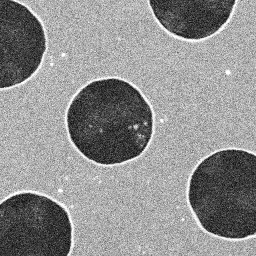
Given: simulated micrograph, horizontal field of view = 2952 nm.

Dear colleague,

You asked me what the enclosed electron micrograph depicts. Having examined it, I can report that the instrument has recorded holes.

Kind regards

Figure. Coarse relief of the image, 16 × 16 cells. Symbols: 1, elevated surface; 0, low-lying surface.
0011111110000001
0001111111000011
0001111111111111
0001111111111111
0011111111111111
1111100011111111
1111000001111111
1111000000111111
1111000001111111
1111100001111101
1111111111110000
1111111111110000
0001111111110000
0000111111110000
0000111111111000
0000111111111111